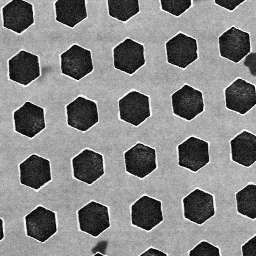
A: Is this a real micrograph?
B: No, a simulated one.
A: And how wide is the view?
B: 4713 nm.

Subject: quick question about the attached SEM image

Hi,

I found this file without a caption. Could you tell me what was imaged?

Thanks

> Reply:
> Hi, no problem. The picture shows a regular array of holes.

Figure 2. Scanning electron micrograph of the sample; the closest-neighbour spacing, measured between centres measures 960 nm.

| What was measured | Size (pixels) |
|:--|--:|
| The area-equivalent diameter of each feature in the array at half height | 33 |